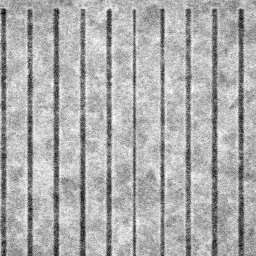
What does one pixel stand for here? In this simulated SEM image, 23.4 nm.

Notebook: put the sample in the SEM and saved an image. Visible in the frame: parallel lines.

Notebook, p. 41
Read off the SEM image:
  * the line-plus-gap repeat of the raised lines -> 617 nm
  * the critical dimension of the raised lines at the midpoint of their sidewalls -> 462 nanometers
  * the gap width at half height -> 0.152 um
